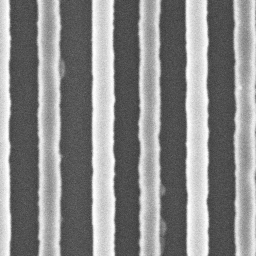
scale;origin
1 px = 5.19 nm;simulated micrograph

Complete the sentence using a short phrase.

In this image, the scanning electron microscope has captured lines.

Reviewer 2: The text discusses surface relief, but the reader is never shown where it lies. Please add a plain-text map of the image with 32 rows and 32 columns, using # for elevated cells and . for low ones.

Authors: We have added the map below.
#....##.....##...###...###...###
#....##.....##...###...###...###
#....##.....##...###...###...###
#....##.....##...###...###...###
#....##.....##...###...###...###
#....##.....##...###...###...###
#....##.....##....##...###...###
#....##.....##....##...###...###
#....##.....##...###...###...###
#....##.....##...###...###...###
#....##.....##...###...###...###
#....##.....##...###...###...###
#....##.....##...###...###....##
#....##.....##...###...###....##
#....##.....##...###...###...###
#....##.....##...###...###...###
#....##.....##...###...###...###
#....##.....##...###...###...###
#....##.....##....##...###...###
#....##.....##...###...###...###
#....##.....##...###...###...###
#....##.....##...###...###...###
#....###....##...###...###....##
#....###....##...###...###....##
#....##.....##....##....##....##
#....##.....##....##...###...###
#....##.....##...###...###....##
#....##.....##...###...###...###
#....##.....##...###...###...###
#....##.....##....##...###...###
#....##.....##...###...###...###
#....##.....##...###...###....##